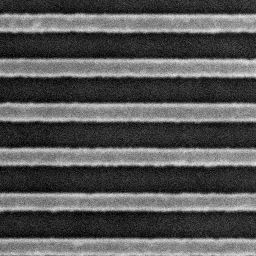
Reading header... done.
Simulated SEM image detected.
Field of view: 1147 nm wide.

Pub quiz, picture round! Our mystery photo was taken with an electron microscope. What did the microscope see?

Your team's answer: lines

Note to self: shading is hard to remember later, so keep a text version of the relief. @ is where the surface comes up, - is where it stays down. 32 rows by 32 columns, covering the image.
--------------------------------
--------------------------------
@@@@@@@@@@@@@@@@@@@@@@@@@@@@@@@@
@@@@@@@@@@@@@@@@@@@@@@@@@@@@@@@@
--------------------------------
--------------------------------
--------------------------------
@@@@@@@@@@@@@@@@-@@@@@@-@-------
@@@@@@@@@@@@@@@@@@@@@@@@@@@@@@@@
-@-@-@---@@--@-----@@---@--@@@@@
--------------------------------
--------------------------------
--------------------------------
@@@@@@@@@@@@@@@@@@@@@@@@@@@@@@@@
@@@@@@@@@@@@@@@@@@@@@@@@@@@@@@@@
--------------------------------
--------------------------------
--------------------------------
--------------------------------
@@@@@@@@@@@@@@@@@@@@@@@@@@@@@@@@
@@@@@@@@@@@@@@@@@@@@@@@@@@@@@@@@
--------------------------------
--------------------------------
--------------------------------
@@@@@@@@@@@@@@@@@@@@@@@@@@@@@@@@
@@@@@@@@@@@@@@@@@@@@@@@@@@@@@@@@
--------------------------------
--------------------------------
--------------------------------
--------------------------------
@@@@@@@@@@@@@@@@@@@@@@@@@@@@@@@@
@@@@@@@@@@@@@@@@@@@@@@@@@@@@@@@@